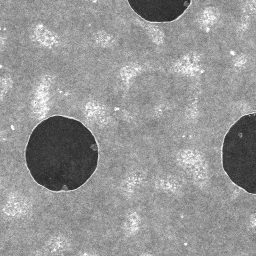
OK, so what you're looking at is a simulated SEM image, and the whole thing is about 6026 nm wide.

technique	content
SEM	holes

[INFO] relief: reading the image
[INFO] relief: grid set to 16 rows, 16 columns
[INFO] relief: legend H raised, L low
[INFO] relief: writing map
HHHHHHHHLLLLHHHH
HHHHHHHHHHHHHHHH
HHHHHHHHHHHHHHHH
HHHHHHHHHHHHHHHH
HHHHHHHHHHHHHHHH
HHHHHHHHHHHHHHHH
HHHHHHHHHHHHHHHH
HHHLLHHHHHHHHHHL
HHLLLLHHHHHHHHLL
HHLLLLHHHHHHHHLL
HHLLLLHHHHHHHHLL
HHLLLHHHHHHHHHHL
HHHHHHHHHHHHHHHH
HHHHHHHHHHHHHHHH
HHHHHHHHHHHHHHHH
HHHHHHHHHHHHHHHH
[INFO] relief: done